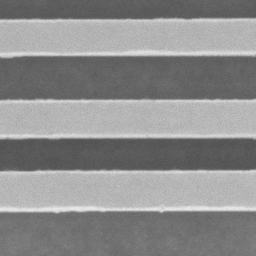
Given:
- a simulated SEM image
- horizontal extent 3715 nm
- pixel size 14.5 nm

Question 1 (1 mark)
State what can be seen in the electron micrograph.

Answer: lines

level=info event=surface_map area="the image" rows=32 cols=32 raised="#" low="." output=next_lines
................................
................................
................#..####.########
################################
################################
################################
################################
................................
................................
................................
................................
................................
...............................#
################################
################################
################################
################################
................................
................................
................................
................................
....############################
################################
################################
################################
################################
................................
................................
................................
................................
................................
................................